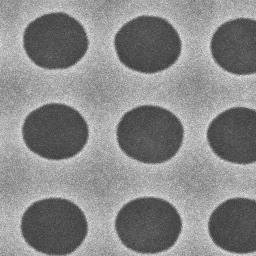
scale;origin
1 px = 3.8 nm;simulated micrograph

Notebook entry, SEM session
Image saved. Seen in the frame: holes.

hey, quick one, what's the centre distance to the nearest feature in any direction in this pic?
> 345 nm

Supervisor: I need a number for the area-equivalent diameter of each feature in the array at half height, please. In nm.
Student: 238